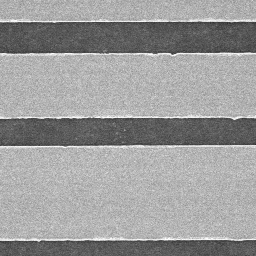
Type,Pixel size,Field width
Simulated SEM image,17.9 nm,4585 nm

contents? one or a few lines or trenches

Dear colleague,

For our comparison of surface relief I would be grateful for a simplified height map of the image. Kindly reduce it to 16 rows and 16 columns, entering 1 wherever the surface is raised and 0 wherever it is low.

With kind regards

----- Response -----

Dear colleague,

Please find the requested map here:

1111111111111111
0000000000000000
0000000000000000
1111111111111111
1111111111111111
1111111111111111
1111111111111111
0000000000000000
0000000000000000
1111111111111111
1111111111111111
1111111111111111
1111111111111111
1111111111111111
1111111111111111
0000000000000000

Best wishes